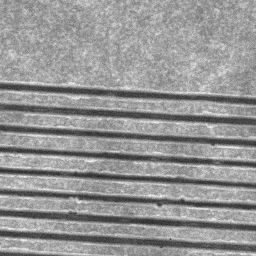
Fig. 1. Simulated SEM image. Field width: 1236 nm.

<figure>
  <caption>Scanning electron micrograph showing parallel lines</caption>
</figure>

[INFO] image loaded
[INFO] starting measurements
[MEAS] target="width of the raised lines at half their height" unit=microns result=0.0627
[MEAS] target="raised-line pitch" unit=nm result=102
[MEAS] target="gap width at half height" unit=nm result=40.4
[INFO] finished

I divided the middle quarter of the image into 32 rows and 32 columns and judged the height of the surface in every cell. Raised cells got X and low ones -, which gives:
XXXXXXXXXXXXXXXXXXXXXXXXXXXXXXXX
XXXXXXXXXXXXXXXXXXXXXXXXXXXXXXXX
XXXXXXXXXXXXXXXXXXXXXXXXXXXXXXXX
XXXXXXXXXXXXXXXXXXXXXXXXXXXXXXXX
XXXXXXXXXXXXXXXXXXXXXXXXXXXXXXXX
-XXXXXXXXXXXXXXXXXXXXXXXXXXXXXXX
-----------------XXXXXXXXXXXXXXX
--------------------------------
XXXXXXXXXXXX--------------------
XXXXXXXXXXXXXXXXXXXXXXXXXXXXX-XX
XXXXXXXXXXXXXXXXXXXXXXXXXXXXXXXX
----------------XXXXXXXXXXXXXXXX
--------------------------------
XXXXXXXXXXX---------------------
XXXXXXXXXXXXXXXXXXXXXXXX--------
XXXXXXXXXXXXXXXXXXXXXXXXXXXXXXXX
----------XXXXXXXXXXXXXXXXXXXXXX
--------------------------XXXXXX
XXXXX---------------------------
XXXXXXXXXXXXXXXXXXXXXX----------
XXXXXXXXXXXXXXXXXXXXXXXXXXXXXXXX
----XXXXXXXXXXXXXXXXXXXXXXXXXXXX
---------------------XXXXXXXXXXX
XXX-----------------------------
XXXXXXXXXXXXXXXXXXXX------------
XXXXXXXXXXXXXXXXXXXXXXXXXXXXXXXX
XXXXXXXXXXXXXXXXXXXXXXXXXXXXXXXX
---------------XXXXXXXXXXXXXXXXX
--------------------------------
XXXXXXXXXXXXXX------------------
XXXXXXXXXXXXXXXXXXXXXXXXXXXXXXX-
XXXXXXXXXXXXXXXXXXXXXXXXXXXXXXXX